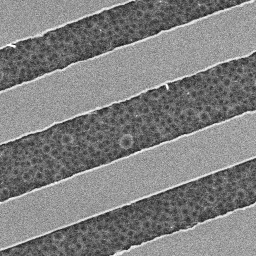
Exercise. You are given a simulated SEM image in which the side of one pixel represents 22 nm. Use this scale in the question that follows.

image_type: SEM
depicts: one or a few lines or trenches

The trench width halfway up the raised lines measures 962 nm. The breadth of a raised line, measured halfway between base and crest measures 1.02 µm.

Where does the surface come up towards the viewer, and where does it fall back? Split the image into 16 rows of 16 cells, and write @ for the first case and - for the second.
@@@@@@@-------@@
@@@@--------@@@@
@--------@@@@@@@
------@@@@@@@@@-
---@@@@@@@@@----
-@@@@@@@@@------
@@@@@@@---------
@@@@----------@@
@----------@@@@@
---------@@@@@@@
------@@@@@@@@--
---@@@@@@@@-----
@@@@@@@@@-------
@@@@@@--------@@
@@@@-------@@@@@
--------@@@@@@@@